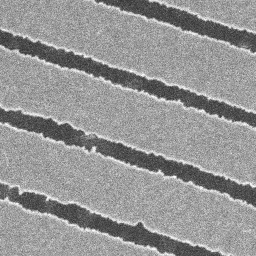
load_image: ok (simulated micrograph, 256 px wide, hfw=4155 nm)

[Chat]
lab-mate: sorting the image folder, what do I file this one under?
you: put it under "one or a few lines or trenches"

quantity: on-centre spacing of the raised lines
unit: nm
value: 1180